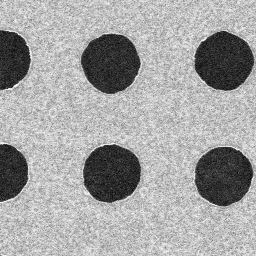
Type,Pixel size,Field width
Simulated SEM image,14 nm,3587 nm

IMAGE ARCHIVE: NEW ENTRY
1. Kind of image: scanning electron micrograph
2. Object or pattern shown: holes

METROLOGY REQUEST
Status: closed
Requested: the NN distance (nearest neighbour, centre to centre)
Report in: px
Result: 111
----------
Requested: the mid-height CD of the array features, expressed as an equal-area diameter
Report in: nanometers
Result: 823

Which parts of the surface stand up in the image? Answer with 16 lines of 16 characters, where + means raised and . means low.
++++++++++++++++
++++++++++++++++
.+++++..+++++..+
..+++....+++....
..+++....+++....
.+++++..+++++..+
++++++++++++++++
++++++++++++++++
++++++++++++++++
.+++++..+++++..+
..+++....+++....
..+++....+++....
++++++.++++++..+
++++++++++++++++
++++++++++++++++
++++++++++++++++